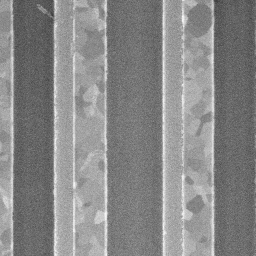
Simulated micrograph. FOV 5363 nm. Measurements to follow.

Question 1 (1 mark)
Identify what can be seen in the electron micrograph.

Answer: lines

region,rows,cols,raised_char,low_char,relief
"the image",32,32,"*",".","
*......******........******.....
*......******........******.....
*......******........******.....
*......******........******.....
*......******........******.....
*......******........******.....
*......******........******.....
*......******........******.....
*......******........******.....
*......******........******.....
*......******........******.....
*......******........******.....
*......******........******.....
*......******........******.....
*......******........******.....
*......******........******.....
*......******........******.....
*......******........******.....
*......******........******.....
*......******........******.....
*......******........******.....
*......******........******.....
*......******........******.....
*......******........******.....
*......******........******.....
*......******........******.....
*......******........******.....
*......******........******.....
*......******........******.....
*......******........******.....
*......******........******.....
*......******........******.....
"